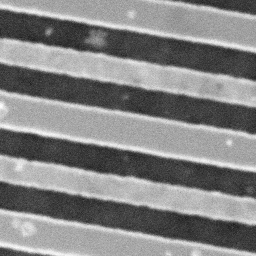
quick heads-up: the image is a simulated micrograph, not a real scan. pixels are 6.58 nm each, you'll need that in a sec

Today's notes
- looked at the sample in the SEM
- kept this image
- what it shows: lines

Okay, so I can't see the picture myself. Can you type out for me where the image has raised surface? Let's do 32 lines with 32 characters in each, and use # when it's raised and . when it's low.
#######################.........
...#########################....
.........#######################
..............##################
.....................###########
####.......................#####
##########......................
################................
....##################..........
.........###################....
...............#################
#....................###########
######.....................#####
############....................
##################..............
#######################.........
....##########################..
.........#######################
...............#################
#....................###########
######.....................#####
###########.....................
##################..............
.....##################.........
...........##################...
.................###############
#......................#########
#######.....................####
#############...................
###################.............
#########################.......
.....#########################..